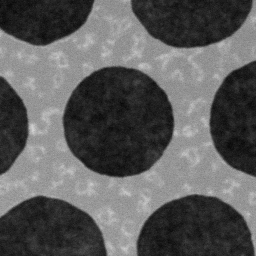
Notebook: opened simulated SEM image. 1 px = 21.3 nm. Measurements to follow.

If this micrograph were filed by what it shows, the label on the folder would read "holes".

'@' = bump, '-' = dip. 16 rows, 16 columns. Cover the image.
------@@--------
-----@@@@------@
@---@@@@@@----@@
@@@@@@@@@@@@@@@@
@@@@@@---@@@@@--
-@@@@-----@@@@--
--@@-------@@---
--@@-------@@---
--@@-------@@---
-@@@------@@@@--
-@@@@@---@@@@@@-
@@@@@@@@@@@@@@@@
@@--@@@@@@@---@@
------@@@------@
------@@@-------
-------@@-------